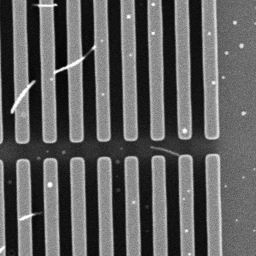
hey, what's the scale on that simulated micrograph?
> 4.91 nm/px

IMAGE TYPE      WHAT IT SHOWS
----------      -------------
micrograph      groups of lines, slits or small figures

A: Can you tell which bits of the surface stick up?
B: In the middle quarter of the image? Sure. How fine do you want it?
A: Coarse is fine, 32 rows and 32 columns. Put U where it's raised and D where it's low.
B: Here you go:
DUUUUDDDUUUDDDDUUUDDDUUUUDDDUUUD
DUUUUDDDUUUDDDDUUUDDDUUUUDDDUUUD
DUUUUDDDUUUDDDDUUUDDDUUUUDDDUUUD
DUUUUDDDUUUDDDDUUUDDDUUUUDDDUUUD
DUUUUDDDUUUDDDDUUUDDDUUUUDDDUUUD
DUUUUDDDUUUDDDDUUUDDDUUUUDDDUUUD
DUUUUDDDUUUDDDDUUUDDDDUUUDDDUUUD
DUUUUDDDUUUDDDDUUUDDDDUUUDDDUUUD
DUUUUDDDUUUDDDDUUUDDDDUUUDDDUUUD
DUUUUDDDUUUDDDDUUUDDDDUUUDDDUUUU
DUUUUDDDUUUDDDDUUUDDDDUUUDDDUUUU
DUUUUDDDUUUDDDDUUUDDDDUUUDDDUUUU
DUUUUDDDUUUDDDDUUUDDDDUUUDDDUUUU
DUUUUDDDUUUDDDDUUUDDDDUUUDDDUUUU
DDUUUDDDUUUDDDDUUUDDDDUUUDDDUUUU
DDUUUDDDUUUDDDDUUUDDDDUUUDDDUUUU
DDUUUDDDUUUDDDDUUUDDDDUUUDDDDUUU
DDUUUDDDUUUUDDDUUUDDDDUUUDDDDUUU
DDUUUDDDUUUUDDDUUUDDDDUUUDDDDUUD
DDUUDDDDDDDDDDDDDDDDDDDDDDDDDDDD
DDDDDDDDDDDDDDDDDDDDDDDDDDDDDDDD
DDDDDDDDDDDDDDDDDDDDDDDDDDDDDDDD
DDDDDDDDDDDDDDDDDDDDDDDDDDDDDDDD
DDUUDDDDDUUDDDDUUUDDDDUUUDDDDUUU
DDUUUDDDUUUUDDDUUUUDDDUUUDDDDUUU
DDUUUDDDUUUUDDDUUUUDDDUUUDDDDUUU
DDUUUDDDUUUUDDDUUUUDDDUUUDDDDUUU
DDUUUDDDUUUUDDDUUUUDDDUUUDDDDUUU
DDUUUDDDDUUUDDDUUUUDDDUUUDDDDUUU
DDUUUDDDDUUUDDDUUUUDDDUUUDDDDUUU
DDUUUDDDDUUUDDDUUUUDDDUUUDDDDUUU
DDUUUDDDDUUUDDDUUUUDDDUUUDDDDUUU